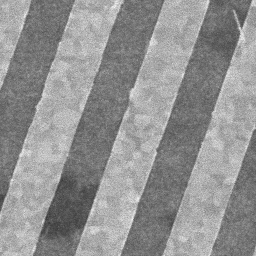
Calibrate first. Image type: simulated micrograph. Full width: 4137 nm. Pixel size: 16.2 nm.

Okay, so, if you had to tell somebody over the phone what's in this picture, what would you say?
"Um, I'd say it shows one or a few lines or trenches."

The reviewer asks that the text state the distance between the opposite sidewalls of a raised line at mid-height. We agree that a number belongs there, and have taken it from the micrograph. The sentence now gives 696 nm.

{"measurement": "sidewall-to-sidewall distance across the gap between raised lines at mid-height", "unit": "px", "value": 41.3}